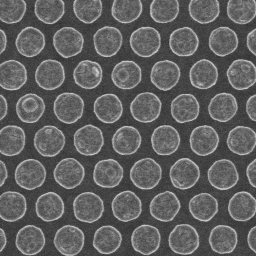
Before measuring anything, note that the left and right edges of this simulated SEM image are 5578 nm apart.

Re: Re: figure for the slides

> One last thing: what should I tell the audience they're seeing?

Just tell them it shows a regular array of raised bodies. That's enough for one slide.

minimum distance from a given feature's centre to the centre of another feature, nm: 822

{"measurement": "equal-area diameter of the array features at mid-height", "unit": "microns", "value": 0.63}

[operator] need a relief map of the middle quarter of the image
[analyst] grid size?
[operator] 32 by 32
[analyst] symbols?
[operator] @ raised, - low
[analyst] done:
---@@@@@@----@@@@@-----@@@@@----
---@@@@@@---@@@@@@@---@@@@@@@---
---@@@@@@---@@@@@@@---@@@@@@@---
---@@@@@@---@@@@@@@---@@@@@@@---
---@@@@@@---@@@@@@@---@@@@@@----
----@@@@-----@@@@@-----@@@@-----
-------------------------@------
@@-----------------@@@----------
@@@@-----@@@@-----@@@@@-----@@@@
@@@@@---@@@@@@---@@@@@@@---@@@@@
@@@@@---@@@@@@---@@@@@@@---@@@@@
@@@@@---@@@@@@@--@@@@@@@---@@@@@
@@@@----@@@@@@---@@@@@@@---@@@@@
@@@@-----@@@@@----@@@@@-----@@@@
@@@-------@@--------@-----------
-----@@------------------@------
----@@@@@-----@@@@-----@@@@@----
---@@@@@@----@@@@@@---@@@@@@----
---@@@@@@@--@@@@@@@---@@@@@@@---
---@@@@@@@--@@@@@@@---@@@@@@@---
---@@@@@@---@@@@@@@---@@@@@@----
---@@@@@@----@@@@@-----@@@@@----
-----@@@------@@@-------@@------
--------------------------------
@@@@-----@@@@-----@@@@@-----@@@@
@@@@----@@@@@@---@@@@@@@---@@@@@
@@@@@---@@@@@@@--@@@@@@@---@@@@@
@@@@@---@@@@@@@--@@@@@@@---@@@@@
@@@@@---@@@@@@---@@@@@@@---@@@@@
@@@@----@@@@@@---@@@@@@----@@@@@
@@@------@@@@-----@@@@@-----@@@@
--------------------------------